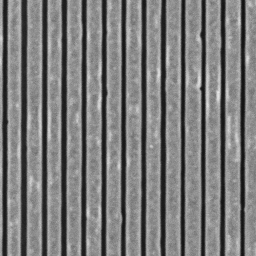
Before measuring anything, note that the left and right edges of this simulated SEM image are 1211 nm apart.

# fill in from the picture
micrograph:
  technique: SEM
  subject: parallel lines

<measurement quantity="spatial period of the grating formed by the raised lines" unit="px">19.9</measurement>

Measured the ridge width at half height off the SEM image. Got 70.9 nanometers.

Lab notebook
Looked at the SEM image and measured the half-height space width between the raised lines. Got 23.6 nanometres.